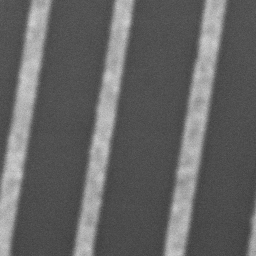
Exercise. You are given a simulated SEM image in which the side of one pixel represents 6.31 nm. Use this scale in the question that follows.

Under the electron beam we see one or a few lines or trenches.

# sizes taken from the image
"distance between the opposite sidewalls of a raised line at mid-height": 99.3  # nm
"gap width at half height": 429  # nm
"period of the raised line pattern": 86.8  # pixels